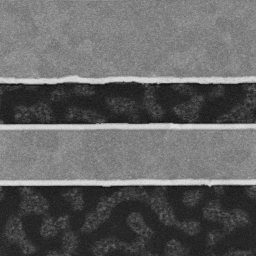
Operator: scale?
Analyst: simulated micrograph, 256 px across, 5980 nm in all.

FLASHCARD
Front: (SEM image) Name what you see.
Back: one or a few lines or trenches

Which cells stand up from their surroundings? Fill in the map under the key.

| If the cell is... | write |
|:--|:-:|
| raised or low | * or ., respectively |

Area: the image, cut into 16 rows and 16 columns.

****************
****************
****************
****************
****************
................
................
................
****************
****************
****************
................
................
................
................
................